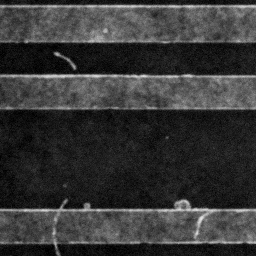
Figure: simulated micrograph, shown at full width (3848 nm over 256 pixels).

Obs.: lines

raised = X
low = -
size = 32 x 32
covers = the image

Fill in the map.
--------------------------------
XXXXXXXXXXXXXXXXXXXXXXXXXXXXXXXX
XXXXXXXXXXXXXXXXXXXXXXXXXXXXXXXX
XXXXXXXXXXXXXXXXXXXXXXXXXXXXXXXX
XXXXXXXXXXXXXXXXXXXXXXXXXXXXXXXX
--------------------------------
--------------------------------
--------------------------------
--------------------------------
XXX----XXXXX-XX-----------------
XXXXXXXXXXXXXXXXXXXXXXXXXXXXXXXX
XXXXXXXXXXXXXXXXXXXXXXXXXXXXXXXX
XXXXXXXXXXXXXXXXXXXXXXXXXXXXXXXX
XXXXXXXXXXXXXXXXXXXXXXXXXXXXXXXX
--------------------------------
--------------------------------
--------------------------------
--------------------------------
--------------------------------
--------------------------------
--------------------------------
--------------------------------
--------------------------------
--------------------------------
--------------------------------
--------------------------------
XXXXXXXXXXXXXXXXXXXXXXXXXXXXXXXX
XXXXXXXXXXXXXXXXXXXXXXXXXXXXXXXX
XXXXXXXXXXXXXXXXXXXXXXXXXXXXXXXX
XXXXXXXXXXXXXXXXXXXXXXXXXXXXXXXX
--------------------------------
--------------------------------